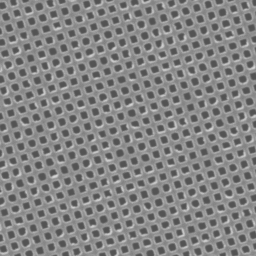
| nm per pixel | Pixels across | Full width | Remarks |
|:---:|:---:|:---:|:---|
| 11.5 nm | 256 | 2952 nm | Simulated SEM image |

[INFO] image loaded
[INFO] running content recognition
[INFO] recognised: a regular array of holes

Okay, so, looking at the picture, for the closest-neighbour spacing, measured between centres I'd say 0.13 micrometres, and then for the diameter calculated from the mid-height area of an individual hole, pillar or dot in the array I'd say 88.2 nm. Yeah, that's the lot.